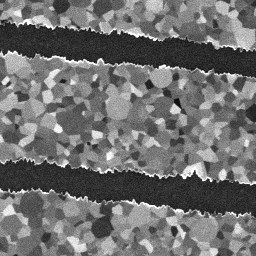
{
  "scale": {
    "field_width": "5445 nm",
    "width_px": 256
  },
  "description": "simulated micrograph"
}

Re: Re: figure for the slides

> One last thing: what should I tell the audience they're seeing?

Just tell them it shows one or a few lines or trenches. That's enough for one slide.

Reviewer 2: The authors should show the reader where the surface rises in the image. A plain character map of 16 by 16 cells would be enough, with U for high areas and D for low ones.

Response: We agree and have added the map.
UUUUUUUUUUUUUUUU
DDUUUUUUUUUUUUUU
DDDDDDDDDDDDUUUU
UDDDDDDDDDDDDDDD
UUUUUUUUUUUUUDDD
UUUUUUUUUUUUUUUU
UUUUUUUUUUUUUUUU
UUUUUUUUUUUUUUUU
UUUUUUUUUUUUUUUU
UUUUUUUUUUUUUUUU
DDDDDUUUUUUUUUUU
DDDDDDDDDDDDDDDD
UUUUUUDDDDDDDDDD
UUUUUUUUUUUUUUUU
UUUUUUUUUUUUUUUU
UUUUUUUUUUUUUUUU